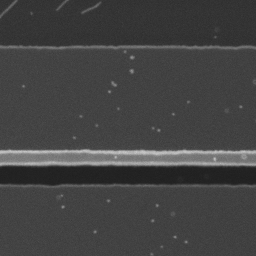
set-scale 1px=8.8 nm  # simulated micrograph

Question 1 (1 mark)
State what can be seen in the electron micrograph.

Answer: lines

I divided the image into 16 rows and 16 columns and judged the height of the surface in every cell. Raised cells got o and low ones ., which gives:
................
................
................
oooooooooooooooo
oooooooooooooooo
oooooooooooooooo
oooooooooooooooo
oooooooooooooooo
oooooooooooooooo
oooooooooooooooo
................
................
oooooooooooooooo
oooooooooooooooo
oooooooooooooooo
oooooooooooooooo